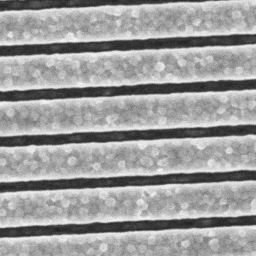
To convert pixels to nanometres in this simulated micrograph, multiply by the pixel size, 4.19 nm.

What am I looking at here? parallel lines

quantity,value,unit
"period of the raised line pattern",190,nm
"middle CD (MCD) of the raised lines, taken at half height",0.143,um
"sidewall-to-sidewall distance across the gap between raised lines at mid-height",44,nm